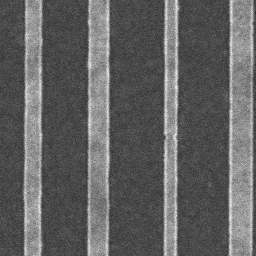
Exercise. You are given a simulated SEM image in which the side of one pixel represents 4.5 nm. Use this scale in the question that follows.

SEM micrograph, one or a few lines or trenches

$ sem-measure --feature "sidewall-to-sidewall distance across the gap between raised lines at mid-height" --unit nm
244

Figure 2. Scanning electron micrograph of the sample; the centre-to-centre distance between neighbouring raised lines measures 312 nm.